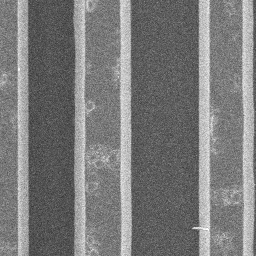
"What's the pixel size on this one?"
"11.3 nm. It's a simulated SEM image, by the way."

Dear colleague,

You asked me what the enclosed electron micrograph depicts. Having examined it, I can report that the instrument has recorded one or a few lines or trenches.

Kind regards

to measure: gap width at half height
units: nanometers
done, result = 760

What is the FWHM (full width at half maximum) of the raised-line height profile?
496 nm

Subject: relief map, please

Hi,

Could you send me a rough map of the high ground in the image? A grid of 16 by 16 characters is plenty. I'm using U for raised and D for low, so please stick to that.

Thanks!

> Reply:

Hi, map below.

UDDDDUUUDDDDDUUD
UDDDDUUUDDDDDUUD
UDDDDUUUDDDDDUUD
UDDDDUUUDDDDDUUD
UDDDDUUUDDDDDUUD
UDDDDUUUDDDDDUUD
UDDDDUUUDDDDDUUD
UDDDDUUUDDDDDUUU
UDDDDUUUDDDDDUUU
UDDDDUUUDDDDDUUD
UDDDDUUUDDDDDUUD
UDDDDUUUDDDDDUUU
UDDDDUUUDDDDDUUU
UDDDDUUUDDDDDUUU
UDDDDUUUDDDDDUUD
UDDDDUUUDDDDDUUD